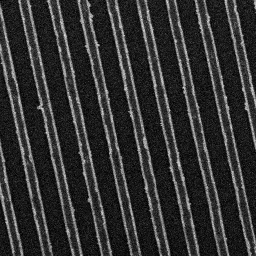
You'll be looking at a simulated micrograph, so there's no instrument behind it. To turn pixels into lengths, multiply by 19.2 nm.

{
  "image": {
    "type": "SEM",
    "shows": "parallel lines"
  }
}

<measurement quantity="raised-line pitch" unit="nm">552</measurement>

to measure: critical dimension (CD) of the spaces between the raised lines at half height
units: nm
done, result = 371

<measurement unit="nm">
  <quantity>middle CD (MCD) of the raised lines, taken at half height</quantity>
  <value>185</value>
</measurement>